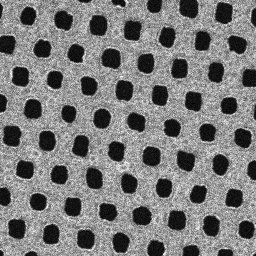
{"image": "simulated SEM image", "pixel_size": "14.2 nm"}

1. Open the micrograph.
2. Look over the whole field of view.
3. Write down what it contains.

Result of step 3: a regular array of holes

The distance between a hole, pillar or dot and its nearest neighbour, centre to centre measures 34.2 pixels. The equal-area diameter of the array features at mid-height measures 272 nm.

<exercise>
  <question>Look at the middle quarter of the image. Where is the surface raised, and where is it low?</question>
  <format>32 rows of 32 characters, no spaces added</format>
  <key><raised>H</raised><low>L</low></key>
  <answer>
HHHHHHHHHHLLLLHHHHLLLLLHHHHLLLLH
HHHHHHHHHHHHHHHHHHHLLLHHHHHLLLLH
HHHHHHHHHHHHHHHHHHHHLHHHHHHLLLLH
HHHHLLLHHHHHHHHHHHHHHHHHHHHLLLHH
HHHHLLLLHHHHHLLLLHHHHHHHHHHHHHHH
HHHHLLLLLHHHHLLLLHHHHHHLLHHHHHHH
HHHHLLLLHHHHHLLLLHHHHHLLLLHHHHHH
HHHHHLLLHHHHHLLLLHHHHHLLLLHHHHHL
HHHHHHHHHHHHHLLLLHHHHHLLLLHHHHLL
HHHHHHHHHHHHHHHHHHHHHHLLLLHHHHLL
LLHHHHHHHHHHHHHHHHHHHHHLLHHHHHLL
LLLHHHHHLLLHHHHHHHHHHHHHHHHHHHHL
LLLHHHHHLLLLHHHHHLLHHHHHHHHHHHHH
LLLHHHHLLLLLHHHHLLLLHHHHHHHHHHHH
LLHHHHHLLLLLHHHHLLLLHHHHHLLLLHHH
HHHHHHHHLLLHHHHHLLLLHHHHHLLLLHHH
HHHHHHHHHHHHHHHHHLLLHHHHHLLLLHHH
HHHHHHHHHHHHHHHHHHHHHHHHHLLLLHHH
HHHLLLHHHHHHHHHHHHHHHHHHHHHHHHHH
HHLLLLHHHHHHLLHHHHHHHHHHHHHHHHHH
HHLLLLHHHHHLLLLHHHHHHLHHHHHHHHHH
HHLLLLHHHHHLLLLHHHHHLLLLHHHHHHHH
HHLLLLHHHHHLLLLHHHHHLLLLHHHHLLLL
HHHHHHHHHHHLLLLHHHHHLLLLHHHHLLLL
HHHHHHHHHHHHHHHHHHHHLLLLHHHHLLLL
HHHHHHHHHHHHHHHHHHHHHLLHHHHHLLLL
LHHHHHLLLHHHHHHHHHHHHHHHHHHHHLLL
LHHHHLLLLLHHHHHLHHHHHHHHHHHHHHHH
LHHHHLLLLLHHHHLLLLHHHHHHHHHHHHHH
HHHHHHLLLLHHHHLLLLHHHHHLLLLHHHHH
HHHHHHLLLLHHHHLLLLHHHHHLLLLHHHHH
HHHHHHHHHHHHHHHLLLHHHHHLLLLHHHHH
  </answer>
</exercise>